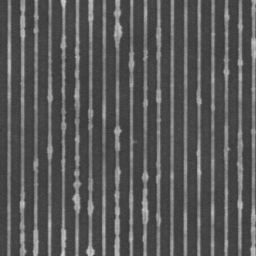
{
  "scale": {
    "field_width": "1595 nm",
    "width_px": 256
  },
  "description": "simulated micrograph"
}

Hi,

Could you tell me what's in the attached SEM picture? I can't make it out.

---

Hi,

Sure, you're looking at parallel lines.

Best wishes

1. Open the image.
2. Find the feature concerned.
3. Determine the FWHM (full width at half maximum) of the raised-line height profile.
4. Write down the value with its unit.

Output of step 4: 17.9 nm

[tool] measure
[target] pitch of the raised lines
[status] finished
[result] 84.6 nanometres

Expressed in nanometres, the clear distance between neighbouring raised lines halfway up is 65.4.